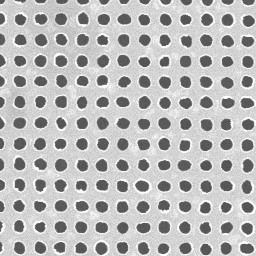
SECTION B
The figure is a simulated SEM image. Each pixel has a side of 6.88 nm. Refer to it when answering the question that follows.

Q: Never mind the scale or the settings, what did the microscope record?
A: a regular array of holes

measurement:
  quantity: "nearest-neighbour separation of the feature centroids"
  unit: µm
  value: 0.138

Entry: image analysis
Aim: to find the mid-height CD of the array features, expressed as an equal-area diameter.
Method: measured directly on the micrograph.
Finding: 80.9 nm